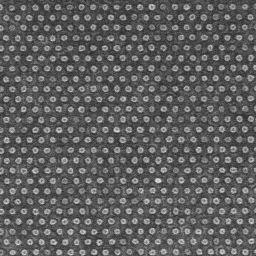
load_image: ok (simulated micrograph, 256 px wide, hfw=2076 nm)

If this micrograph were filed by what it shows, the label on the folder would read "a regular array of raised bodies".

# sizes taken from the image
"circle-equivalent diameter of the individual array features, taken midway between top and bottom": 44.8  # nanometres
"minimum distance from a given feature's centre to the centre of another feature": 91.3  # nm